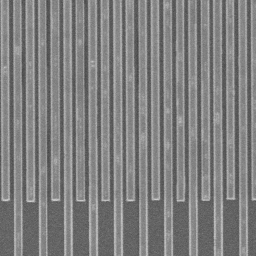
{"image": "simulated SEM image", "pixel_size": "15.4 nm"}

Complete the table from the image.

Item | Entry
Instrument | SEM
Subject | parallel lines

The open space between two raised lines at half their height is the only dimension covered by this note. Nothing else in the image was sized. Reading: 5.5 pixels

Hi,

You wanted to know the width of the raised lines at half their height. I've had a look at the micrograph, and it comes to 114 nm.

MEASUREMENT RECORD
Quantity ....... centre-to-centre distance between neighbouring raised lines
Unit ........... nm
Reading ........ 192